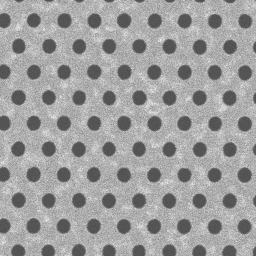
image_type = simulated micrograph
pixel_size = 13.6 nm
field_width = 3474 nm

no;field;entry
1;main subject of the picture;a regular array of holes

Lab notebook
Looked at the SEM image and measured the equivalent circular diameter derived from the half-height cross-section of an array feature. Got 15 px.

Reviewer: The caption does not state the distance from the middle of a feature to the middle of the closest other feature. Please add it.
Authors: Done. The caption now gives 401 nm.